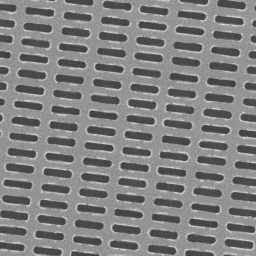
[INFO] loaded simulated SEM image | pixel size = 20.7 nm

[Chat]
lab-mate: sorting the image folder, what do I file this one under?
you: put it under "a regular array of holes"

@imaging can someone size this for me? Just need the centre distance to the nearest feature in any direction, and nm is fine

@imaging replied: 322